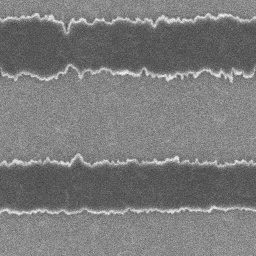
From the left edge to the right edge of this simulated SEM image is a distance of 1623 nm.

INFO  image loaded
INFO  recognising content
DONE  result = one or a few lines or trenches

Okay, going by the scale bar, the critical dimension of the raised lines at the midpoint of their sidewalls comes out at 337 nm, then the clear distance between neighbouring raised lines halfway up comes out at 547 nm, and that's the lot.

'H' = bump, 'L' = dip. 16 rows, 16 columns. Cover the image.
LLLLLLLLLLLLLLLL
HHHHHHHHHHHHHHHH
HHHHHHHHHHHHHHHH
HHHHHHHHHHHHHHHH
HHHHLHLHHHHHHHHH
LLLLLLLLLLLLLLLL
LLLLLLLLLLLLLLLL
LLLLLLLLLLLLLLLL
LLLLLLLLLLLLLLLL
LLLLLLLLLLLLLLLL
HHHHHHHHHHHHHHHH
HHHHHHHHHHHHHHHH
HHHHHHHHHHHHHHHH
LLLLLLLLLLLLLLLL
LLLLLLLLLLLLLLLL
LLLLLLLLLLLLLLLL